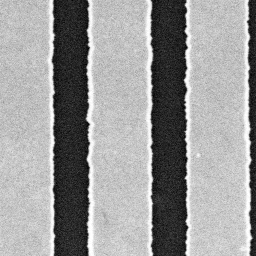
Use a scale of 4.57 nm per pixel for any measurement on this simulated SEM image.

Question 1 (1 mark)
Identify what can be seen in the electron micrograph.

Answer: lines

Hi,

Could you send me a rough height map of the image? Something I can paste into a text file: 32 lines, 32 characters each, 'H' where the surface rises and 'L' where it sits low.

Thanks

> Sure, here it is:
HHHHHHHLLLLHHHHHHHHLLLLHHHHHHHHL
HHHHHHLLLLLHHHHHHHHLLLLHHHHHHHHL
HHHHHHHLLLLHHHHHHHHLLLLHHHHHHHHL
HHHHHHLLLLLHHHHHHHHLLLLHHHHHHHHL
HHHHHHHLLLLHHHHHHHHLLLLHHHHHHHHL
HHHHHHHLLLLHHHHHHHHLLLLHHHHHHHHL
HHHHHHHLLLLHHHHHHHHLLLLHHHHHHHHL
HHHHHHLLLLLHHHHHHHHLLLLHHHHHHHHL
HHHHHHHLLLLHHHHHHHHLLLLHHHHHHHHL
HHHHHHLLLLLHHHHHHHHLLLLHHHHHHHHL
HHHHHHHLLLLHHHHHHHHLLLLHHHHHHHHL
HHHHHHHLLLLHHHHHHHHLLLLHHHHHHHHL
HHHHHHLLLLLHHHHHHHHLLLLHHHHHHHHL
HHHHHHHLLLLHHHHHHHHLLLLHHHHHHHHL
HHHHHHHLLLLHHHHHHHHLLLLHHHHHHHHL
HHHHHHHLLLLHHHHHHHHLLLLHHHHHHHHL
HHHHHHHLLLLHHHHHHHHLLLLHHHHHHHHL
HHHHHHHLLLLHHHHHHHHLLLLHHHHHHHHL
HHHHHHHLLLLHHHHHHHHLLLLHHHHHHHHL
HHHHHHHLLLLHHHHHHHHLLLLHHHHHHHHL
HHHHHHHLLLLHHHHHHHHLLLLHHHHHHHHL
HHHHHHHLLLLHHHHHHHHLLLLHHHHHHHHL
HHHHHHHLLLLHHHHHHHHLLLLHHHHHHHHL
HHHHHHHLLLLHHHHHHHHLLLLHHHHHHHHL
HHHHHHHLLLLHHHHHHHHLLLLHHHHHHHHL
HHHHHHHLLLLHHHHHHHHLLLLHHHHHHHHL
HHHHHHHLLLLHHHHHHHHLLLLHHHHHHHHL
HHHHHHHLLLLHHHHHHHHLLLLHHHHHHHHL
HHHHHHHLLLLHHHHHHHHLLLLLHHHHHHHL
HHHHHHHLLLLHHHHHHHHLLLLHHHHHHHHL
HHHHHHHLLLLHHHHHHHHLLLLHHHHHHHHL
HHHHHHHLLLLHHHHHHHHLLLLHHHHHHHHL